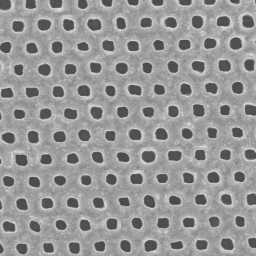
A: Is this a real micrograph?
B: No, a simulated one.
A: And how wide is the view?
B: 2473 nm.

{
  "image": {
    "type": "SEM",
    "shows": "a regular array of holes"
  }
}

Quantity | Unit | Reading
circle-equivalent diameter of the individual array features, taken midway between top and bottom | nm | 111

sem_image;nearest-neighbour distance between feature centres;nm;241